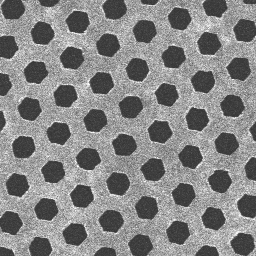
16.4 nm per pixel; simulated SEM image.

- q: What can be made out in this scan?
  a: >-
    a regular array of holes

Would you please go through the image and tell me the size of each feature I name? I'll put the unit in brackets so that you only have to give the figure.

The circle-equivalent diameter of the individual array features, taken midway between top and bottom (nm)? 378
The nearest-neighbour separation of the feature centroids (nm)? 620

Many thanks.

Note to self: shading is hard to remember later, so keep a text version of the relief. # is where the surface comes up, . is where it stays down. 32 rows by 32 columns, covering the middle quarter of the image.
....############.....####....###
###############......###########
########...#####.....###########
#######.....####....############
######......####################
..#####.....############....####
...####.....###########.....####
...######..############......###
...############....####......###
...###########.....####.....####
..############......######.#####
#######..#####......###########.
######....####.....############.
#####......#####..############..
#####......###########....#####.
.####.....###########.....#####.
.#####...############......#####
..############.######......#####
.############....#####....######
.###########......#####..#######
############......############..
####....#####.....###########...
####.....####....############...
###......####################...
###......############....####...
####....############.....#####..
######.############......#######
############...#####.....#######
###########.....####....########
###########.....################
###...#####.....############....
##.....####.....###########.....